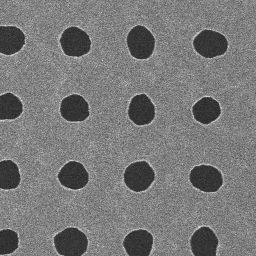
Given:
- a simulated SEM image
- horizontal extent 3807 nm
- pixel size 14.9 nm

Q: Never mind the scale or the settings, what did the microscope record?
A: a regular array of holes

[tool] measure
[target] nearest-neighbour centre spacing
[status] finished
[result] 65.6 pixels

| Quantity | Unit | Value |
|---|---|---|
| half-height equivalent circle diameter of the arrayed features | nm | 449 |